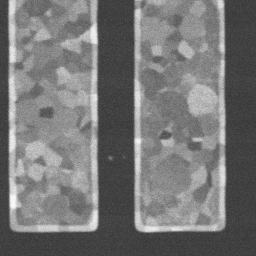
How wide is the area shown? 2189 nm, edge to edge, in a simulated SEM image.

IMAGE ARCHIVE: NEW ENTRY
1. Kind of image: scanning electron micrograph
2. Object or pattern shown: wiring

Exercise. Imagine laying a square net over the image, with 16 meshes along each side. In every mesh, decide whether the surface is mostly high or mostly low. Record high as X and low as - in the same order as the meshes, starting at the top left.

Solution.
-XXXXX---XXXXX--
-XXXXX---XXXXX--
-XXXXX---XXXXX--
-XXXXX---XXXXX--
-XXXXX---XXXXX--
-XXXXX---XXXXX--
-XXXXX---XXXXX--
-XXXXX---XXXXX--
-XXXXX---XXXXX--
-XXXXX---XXXXX--
-XXXXX---XXXXX--
-XXXXX---XXXXX--
-XXXXX---XXXXX--
-XXXXX---XXXXX--
----------------
----------------